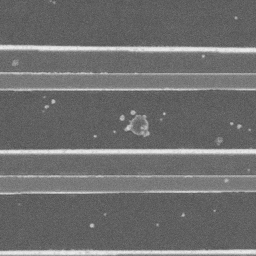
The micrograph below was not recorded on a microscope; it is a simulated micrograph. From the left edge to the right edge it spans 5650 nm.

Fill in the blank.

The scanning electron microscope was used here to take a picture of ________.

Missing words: lines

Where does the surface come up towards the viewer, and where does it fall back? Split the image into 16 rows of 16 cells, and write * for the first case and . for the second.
................
................
................
****************
****************
****************
................
................
................
................
****************
****************
................
................
................
................